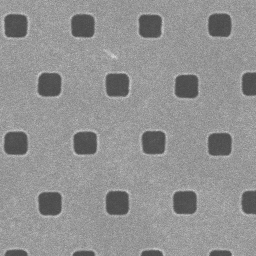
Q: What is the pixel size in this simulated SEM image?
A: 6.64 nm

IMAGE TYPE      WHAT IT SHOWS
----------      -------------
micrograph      a regular array of holes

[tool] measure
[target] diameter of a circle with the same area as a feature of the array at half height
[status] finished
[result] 0.173 um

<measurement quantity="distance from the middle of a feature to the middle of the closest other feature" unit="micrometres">0.446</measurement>